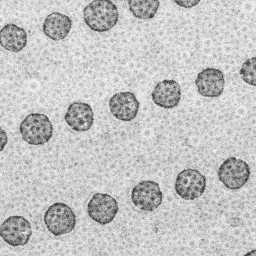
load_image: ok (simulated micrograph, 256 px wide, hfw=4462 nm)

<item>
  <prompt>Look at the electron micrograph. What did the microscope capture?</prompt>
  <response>a regular array of holes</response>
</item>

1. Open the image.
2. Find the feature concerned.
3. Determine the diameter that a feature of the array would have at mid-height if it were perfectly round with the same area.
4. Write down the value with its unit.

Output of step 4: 526 nm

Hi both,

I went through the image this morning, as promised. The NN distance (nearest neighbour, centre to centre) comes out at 780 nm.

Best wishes